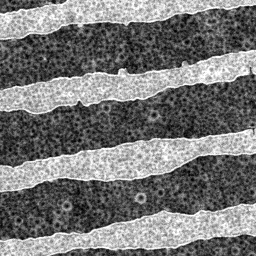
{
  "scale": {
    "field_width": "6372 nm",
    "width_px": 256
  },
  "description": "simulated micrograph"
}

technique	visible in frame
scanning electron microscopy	one or a few lines or trenches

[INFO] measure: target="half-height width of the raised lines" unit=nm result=606